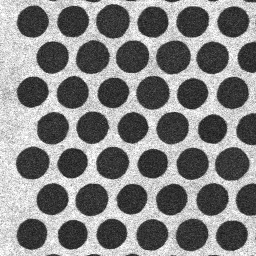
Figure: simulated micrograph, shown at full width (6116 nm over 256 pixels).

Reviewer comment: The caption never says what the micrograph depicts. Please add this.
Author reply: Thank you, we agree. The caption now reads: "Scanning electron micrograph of a regular array of holes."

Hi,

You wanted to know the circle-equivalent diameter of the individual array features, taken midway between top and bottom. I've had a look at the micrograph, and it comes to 763 nm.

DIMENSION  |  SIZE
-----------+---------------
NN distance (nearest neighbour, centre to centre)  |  952 nm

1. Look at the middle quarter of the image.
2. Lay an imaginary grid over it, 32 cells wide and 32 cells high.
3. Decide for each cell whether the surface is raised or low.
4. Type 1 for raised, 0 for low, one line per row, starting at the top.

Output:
11100000000110000000011000000001
11110000001111100001111110000011
11111100111111111111111111001111
10001111111000111111000001111111
00000111110000011110000000111100
00000011100000001100000000111000
00000011100000001100000000110000
00000011000000001100000000110000
00000011100000001100000000110000
00000111100000011110000000111000
00001111110000111110000001111100
11111111111111111111100111111111
11111000011111110001111110000011
11110000001111000000111100000001
01100000000111000000011000000001
01100000000111000000011000000001
01100000000110000000011000000001
01100000000111000000011000000001
11110000001111000000111100000011
11111000011111100001111110000111
11111111111111111111111111111111
00001111110000011111100011111100
00000111100000001110000001111000
00000011000000001110000000110000
00000011000000001110000000110000
00000011000000001100000000110000
00000111000000001110000000110000
00000111100000011110000001111000
10111111110000111111100111111100
11111111111111111111111111111111
11111000001111100001111111000111
11110000001111000000111100000011